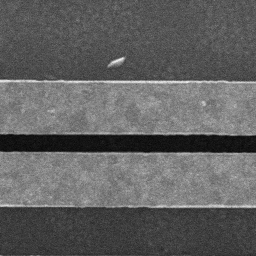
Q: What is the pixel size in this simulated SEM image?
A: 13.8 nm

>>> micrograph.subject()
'lines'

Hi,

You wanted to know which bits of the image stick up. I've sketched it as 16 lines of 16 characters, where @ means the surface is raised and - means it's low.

----------------
----------------
----------------
----------------
----------------
@@@@@@@@@@@@@@@@
@@@@@@@@@@@@@@@@
@@@@@@@@@@@@@@@@
----------------
----------------
@@@@@@@@@@@@@@@@
@@@@@@@@@@@@@@@@
@@@@@@@@@@@@@@@@
----------------
----------------
----------------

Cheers